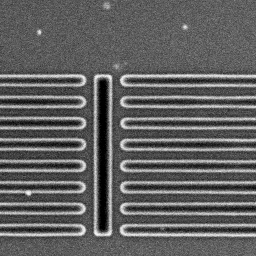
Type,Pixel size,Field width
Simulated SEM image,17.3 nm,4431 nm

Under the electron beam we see groups of lines, slits or small figures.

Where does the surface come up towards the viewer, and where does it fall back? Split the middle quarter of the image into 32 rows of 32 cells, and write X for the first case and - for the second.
--------------------------------
--------------------------------
--------------------------------
XXXXX---XXXX---XXXXXXXXXXXXXXXXX
XXXXX---XXXX--XXXXXXXXXXXXXXXXXX
--------XXXX--------------------
--------XXXX--------------------
--------XXXX--------------------
XXXXX---XXXX---XXXXXXXXXXXXXXXXX
XXXXX---XXXX--XXXXXXXXXXXXXXXXXX
XXXXX---XXXX---XXXXXXXXXXXXXXXXX
--------XXXX--------------------
--------XXXX--------------------
--------XXXX--------------------
XXXXX---XXXX--XXXXXXXXXXXXXXXXXX
XXXXX---XXXX---XXXXXXXXXXXXXXXXX
--------XXXX--------------------
--------XXXX--------------------
--------XXXX--------------------
XXXXX---XXXX--XXXXXXXXXXXXXXXXXX
XXXXX---XXXX--XXXXXXXXXXXXXXXXXX
--------XXXX--------------------
--------XXXX--------------------
--------XXXX--------------------
XXXXX---XXXX---XXXXXXXXXXXXXXXXX
XXXXX---XXXX--XXXXXXXXXXXXXXXXXX
XXXXX---XXXX---XXXXXXXXXXXXXXXXX
--------XXXX--------------------
--------XXXX--------------------
X-------XXXX--------------------
XXXXX---XXXX--XXXXXXXXXXXXXXXXXX
XXXXX---XXXX--XXXXXXXXXXXXXXXXXX